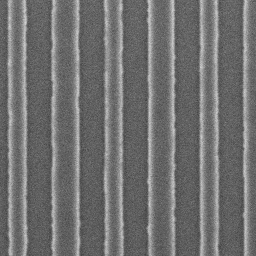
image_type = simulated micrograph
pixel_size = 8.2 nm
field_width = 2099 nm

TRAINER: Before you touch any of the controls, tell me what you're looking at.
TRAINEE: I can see lines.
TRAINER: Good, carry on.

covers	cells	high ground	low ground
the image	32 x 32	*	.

.**....***...**....***...**....*
.**....***...**....***...**....*
.**....***...**....***...**....*
.**....***...**....***...**....*
.**....***...**....***...**....*
.**....***...**....***...**....*
.**....***...**....***...**....*
.**....***...**....***...**....*
.**....***...**....***...**....*
.**....***...**....***...**....*
.**....***...**....***...**....*
.**....***...**....***...**....*
.**....***...**....***...**....*
.**....***...**....***...**....*
.**....***...**....***...**....*
.**....***...**....***...**....*
.**....***...**....***...**....*
.**....***...**....***...**....*
.**....***...**....***...**....*
.**....***...**....***...**....*
.**....***...**....***...**....*
.**....***...**....***...**....*
.**....***...**....***...**....*
.**....***...**....***...**....*
.**....***...**....***...**....*
.**....***...**....***...**....*
.**....***...**....***...**....*
.**....***...**....***...**....*
.**....***...**....***...**....*
.**....***...**....***...**....*
.**....***...**....***...**....*
.**....***...**....***...**....*